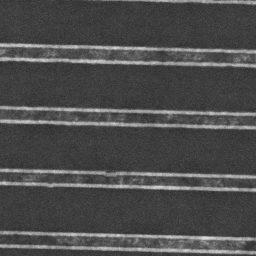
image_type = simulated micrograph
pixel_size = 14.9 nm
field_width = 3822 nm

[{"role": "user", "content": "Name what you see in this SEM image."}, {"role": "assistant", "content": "one or a few lines or trenches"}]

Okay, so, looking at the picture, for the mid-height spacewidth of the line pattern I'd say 0.731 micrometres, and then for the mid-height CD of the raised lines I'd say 13.5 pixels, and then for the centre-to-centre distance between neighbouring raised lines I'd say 931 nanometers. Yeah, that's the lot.